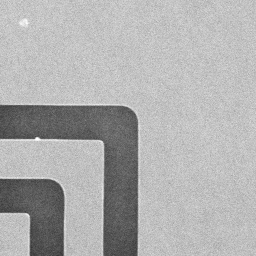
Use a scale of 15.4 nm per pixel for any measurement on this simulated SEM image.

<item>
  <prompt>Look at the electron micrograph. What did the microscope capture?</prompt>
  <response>groups of lines, slits or small figures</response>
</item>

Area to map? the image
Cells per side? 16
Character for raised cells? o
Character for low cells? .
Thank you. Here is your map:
oooooooooooooooo
oooooooooooooooo
oooooooooooooooo
oooooooooooooooo
oooooooooooooooo
oooooooooooooooo
oooooooooooooooo
.........ooooooo
.........ooooooo
oooooo...ooooooo
oooooo...ooooooo
....oo...ooooooo
....oo...ooooooo
oo..oo...ooooooo
oo..oo...ooooooo
oo..oo...ooooooo